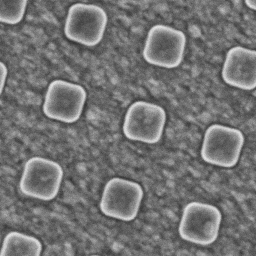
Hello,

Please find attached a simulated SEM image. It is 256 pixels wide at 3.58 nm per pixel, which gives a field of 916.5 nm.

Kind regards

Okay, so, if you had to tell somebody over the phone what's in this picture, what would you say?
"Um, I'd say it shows a regular array of raised bodies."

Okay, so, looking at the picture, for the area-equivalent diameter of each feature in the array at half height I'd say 144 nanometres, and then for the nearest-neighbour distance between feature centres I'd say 0.287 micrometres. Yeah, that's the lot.